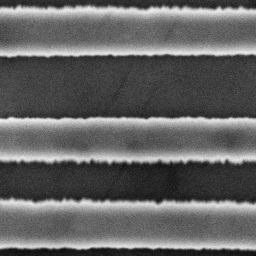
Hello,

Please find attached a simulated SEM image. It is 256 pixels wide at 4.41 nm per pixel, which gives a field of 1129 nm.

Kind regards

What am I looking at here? lines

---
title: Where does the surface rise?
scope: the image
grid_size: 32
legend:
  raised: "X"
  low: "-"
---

--------------------------------
XXXXXXXXXXXXXXXXXXXXXXXXXXXXXXXX
XXXXXXXXXXXXXXXXXXXXXXXXXXXXXXXX
XXXXXXXXXXXXXXXXXXXXXXXXXXXXXXXX
XXXXXXXXXXXXXXXXXXXXXXXXXXXXXXXX
XXXXXXXXXXXXXXXXXXXXXXXXXXXXXXXX
XXXXXXXXXXXXXXXXXXXXXXXXXXXXXXXX
--------------------------------
--------------------------------
--------------------------------
--------------------------------
--------------------------------
--------------------------------
--------------------------------
--------------------------------
XXXXXXXXXXXXXXXXXXXXXXXXXXXXXXXX
XXXXXXXXXXXXXXXXXXXXXXXXXXXXXXXX
XXXXXXXXXXXXXXXXXXXXXXXXXXXXXXXX
XXXXXXXXXXXXXXXXXXXXXXXXXXXXXXXX
XXXXXXXXXXXXXXXXXXXXXXXXXXXXXXXX
--------------------------------
--------------------------------
--------------------------------
--------------------------------
--------------------------------
XXXX-XXXXXXXXXXXXXX-XX-XX---X---
XXXXXXXXXXXXXXXXXXXXXXXXXXXXXXXX
XXXXXXXXXXXXXXXXXXXXXXXXXXXXXXXX
XXXXXXXXXXXXXXXXXXXXXXXXXXXXXXXX
XXXXXXXXXXXXXXXXXXXXXXXXXXXXXXXX
XXXXXXXXXXXXXXXXXXXXXXXXXXXXXXXX
--------------------------------